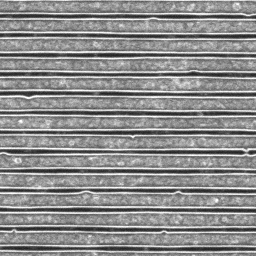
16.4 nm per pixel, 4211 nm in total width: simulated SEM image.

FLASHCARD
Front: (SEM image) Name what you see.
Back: parallel lines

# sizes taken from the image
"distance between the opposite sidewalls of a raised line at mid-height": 101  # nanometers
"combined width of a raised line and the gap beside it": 318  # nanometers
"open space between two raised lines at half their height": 218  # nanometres